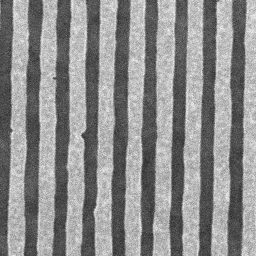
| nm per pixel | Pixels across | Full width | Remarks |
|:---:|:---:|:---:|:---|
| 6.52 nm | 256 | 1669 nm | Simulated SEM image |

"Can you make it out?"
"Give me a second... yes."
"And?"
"parallel lines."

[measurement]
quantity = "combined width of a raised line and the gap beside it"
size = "190 nanometers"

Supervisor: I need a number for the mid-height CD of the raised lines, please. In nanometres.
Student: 96.1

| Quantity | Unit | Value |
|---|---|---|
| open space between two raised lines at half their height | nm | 90.4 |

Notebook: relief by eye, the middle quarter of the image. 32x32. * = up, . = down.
.****....***....****...****....*
.****....***....****...****....*
..***....***....****...****....*
.****....****...****...****....*
.****....***....****...****....*
..***....***....****...****....*
..***....***....****...****....*
..***....***....****...****....*
..***....***....****...****....*
..***....***....****...****....*
..***....***....****...****....*
..***....***....***....****....*
..***....***....***....****....*
..***....****...***....****....*
.****....****...***....****....*
.****....***....***....****...**
..***....***....***.....***...**
..**.....***....***....****...**
..**.....***....***....****....*
..***....***....***....****...**
..***....***....***....****...**
.****....***....***....****...**
.****....***....***....****...**
.****....***....***....****...**
.****....***....***....****...**
.****....***....***....****...**
.****....***....***....****...**
.****...****....***....****...**
.****....***....***....***....**
.****....***....***....***....**
.****....***....***....***....**
.****....***....***....***....**